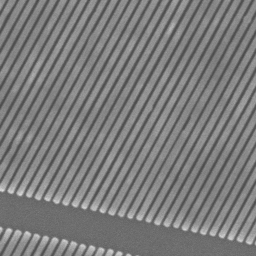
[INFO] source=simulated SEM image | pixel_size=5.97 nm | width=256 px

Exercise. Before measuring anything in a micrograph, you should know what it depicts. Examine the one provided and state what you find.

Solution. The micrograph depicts parallel lines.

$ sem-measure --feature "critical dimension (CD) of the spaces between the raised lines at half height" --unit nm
17.1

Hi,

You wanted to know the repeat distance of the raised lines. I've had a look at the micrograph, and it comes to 53.6 nanometers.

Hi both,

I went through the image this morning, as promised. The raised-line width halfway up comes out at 33.4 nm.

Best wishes